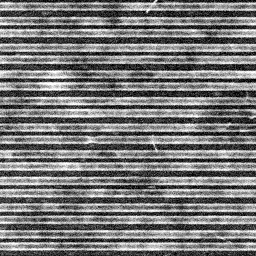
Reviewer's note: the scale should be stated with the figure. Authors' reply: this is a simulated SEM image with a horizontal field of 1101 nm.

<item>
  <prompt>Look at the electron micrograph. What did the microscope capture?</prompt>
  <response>parallel lines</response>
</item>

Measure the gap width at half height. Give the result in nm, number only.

22.6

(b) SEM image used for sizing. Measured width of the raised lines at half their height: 33.3 nm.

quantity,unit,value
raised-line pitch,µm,0.0573